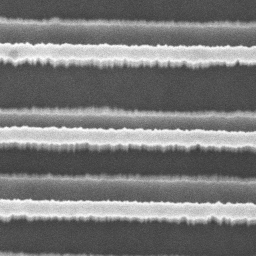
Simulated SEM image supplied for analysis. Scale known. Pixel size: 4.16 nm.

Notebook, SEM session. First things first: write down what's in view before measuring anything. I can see lines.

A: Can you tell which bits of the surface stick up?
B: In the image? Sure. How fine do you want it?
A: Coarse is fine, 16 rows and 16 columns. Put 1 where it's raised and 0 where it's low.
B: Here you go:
0000000000000000
1111111110000000
1111111111111111
1111111111111111
0000000000000000
0000000000000000
0000000000000000
1111111111111111
1111111111111111
0000000000000000
0000000000000000
1111111111111111
1111111111111111
1111111111111111
0000000000000000
0000000000000000